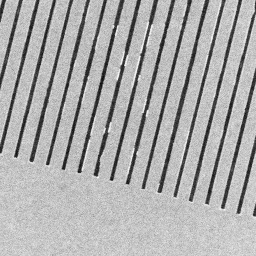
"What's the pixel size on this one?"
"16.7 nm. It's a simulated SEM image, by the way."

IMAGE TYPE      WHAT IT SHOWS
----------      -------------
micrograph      parallel lines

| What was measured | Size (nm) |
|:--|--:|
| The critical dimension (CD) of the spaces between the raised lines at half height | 79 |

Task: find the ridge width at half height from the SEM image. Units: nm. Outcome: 196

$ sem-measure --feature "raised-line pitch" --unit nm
274